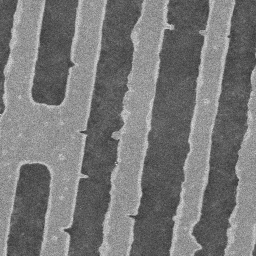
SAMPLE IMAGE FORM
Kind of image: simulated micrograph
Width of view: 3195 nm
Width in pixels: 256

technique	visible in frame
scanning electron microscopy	one or a few lines or trenches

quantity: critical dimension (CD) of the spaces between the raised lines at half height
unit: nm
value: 455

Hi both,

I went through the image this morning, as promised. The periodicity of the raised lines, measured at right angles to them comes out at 792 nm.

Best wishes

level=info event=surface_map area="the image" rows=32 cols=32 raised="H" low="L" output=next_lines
LLLHHHLLLLHHHLLLLLHHHLLLLLHHHLLL
LLHHHLLLLLHHHLLLLLHHHLLLLLHHHLLL
LLHHHLLLLLHHHLLLLHHHHLLLLLHHHLLL
LLHHHLLLLLHHHLLLLHHHHLLLLLHHLLLL
LLHHHLLLLHHHLLLLLHHHLLLLLHHHLLLL
LLHHHLLLLHHHLLLLLHHHLLLLLLHHLLLL
LHHHHLLLLHHHLLLLLHHHLLLLLLHHLLLL
LHHHLLLLLHHHLLLLLHHHLLLLLHHHLLLL
LHHHLLLLLHHHLLLLLHHHLLLLLHHHLLLL
LHHHLLLLLHHHLLLLHHHHLLLLLHHHLLLH
LHHHLLLLLHHHLLLLHHHLLLLLLHHHLLLH
LHHHLLLLHHHLLLLLHHHLLLLLLHHLLLLH
LHHHLLLLHHHLLLLLHHHLLLLLHHHLLLLH
LHHHHHHHHHHLLLLLHHHLLLLLHHHLLLLH
HHHHHHHHHHHLLLLLHHHLLLLLHHHLLLLH
HHHHHHHHHHHLLLLLHHHLLLLLHHHLLLLH
HHHHHHHHHHLLLLLHHHLLLLLLHHLLLLLH
HHHHHHHHHHLLLLLHHHLLLLLLHHLLLLLH
HHHHHHHHHHLLLLLHHHLLLLLLHHLLLLHH
HHHHHHHHHHLLLLLHHHLLLLLLHHLLLLHH
HHHLLHHHHHLLLLLHHHLLLLLHHHLLLLHH
HHLLLLHHHHLLLLLHHHLLLLLHHHLLLHHH
HHLLLLHHHHLLLLHHHLLLLLLHHHLLLLHH
HHLLLLHHHHLLLLHHHLLLLLLHHLLLLLHH
HHLLLLHHHLLLLLHHHLLLLLLHHLLLLLHH
HHLLLLHHHLLLLLHHHLLLLLLHHLLLLLHH
HLLLLLHHHLLLLLHHHLLLLLLHHLLLLHHH
HLLLLLHHHLLLLHHHHLLLLLHHHLLLLHHH
HLLLLLHHLLLLLHHHHLLLLLHHLLLLLHHH
HLLLLLHHLLLLLHHHLLLLLLHHLLLLLHHH
HLLLLHHHLLLLLHHHLLLLLLHHHLLLLHHH
HLLLLHHHLLLLLHHHLLLLLHHHLLLLHHHH